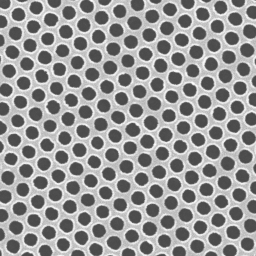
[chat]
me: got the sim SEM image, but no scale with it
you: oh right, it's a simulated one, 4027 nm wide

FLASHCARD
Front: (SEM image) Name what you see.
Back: a regular array of holes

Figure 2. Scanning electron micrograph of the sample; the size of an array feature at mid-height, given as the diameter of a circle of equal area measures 224 nanometres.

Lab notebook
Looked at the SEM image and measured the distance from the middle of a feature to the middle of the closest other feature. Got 296 nm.